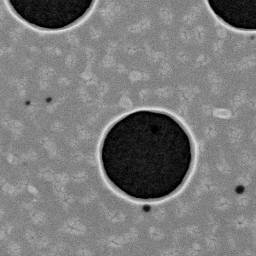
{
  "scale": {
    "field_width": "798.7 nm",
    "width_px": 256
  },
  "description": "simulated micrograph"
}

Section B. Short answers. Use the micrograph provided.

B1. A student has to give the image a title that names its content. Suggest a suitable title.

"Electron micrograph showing holes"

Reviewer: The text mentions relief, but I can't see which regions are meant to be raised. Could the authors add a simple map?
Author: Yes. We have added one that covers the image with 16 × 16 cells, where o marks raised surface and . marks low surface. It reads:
o.....ooooooo...
oo...ooooooooo..
oooooooooooooooo
oooooooooooooooo
oooooooooooooooo
oooooooooooooooo
oooooooooooooooo
ooooooo....ooooo
ooooooo.....oooo
oooooo......oooo
oooooo......oooo
ooooooo....ooooo
ooooooooo.oooooo
oooooooooooooooo
oooooooooooooooo
oooooooooooooooo